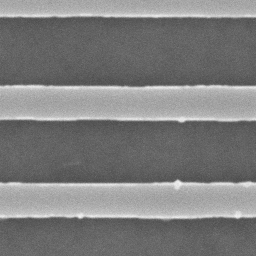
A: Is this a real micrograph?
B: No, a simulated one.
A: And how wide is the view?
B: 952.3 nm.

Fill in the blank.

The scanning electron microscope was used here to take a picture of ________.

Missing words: lines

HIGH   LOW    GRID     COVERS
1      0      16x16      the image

1111111111111111
0000000000000000
0000000000000000
0000000000000000
0000000000000000
1111111111111111
1111111111111111
0000000000010010
0000000000000000
0000000000000000
0000000000000000
1100000001111111
1111111111111111
1111111111111111
0000000000000000
0000000000000000